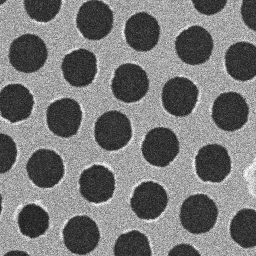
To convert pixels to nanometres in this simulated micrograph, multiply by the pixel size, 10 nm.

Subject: a regular array of holes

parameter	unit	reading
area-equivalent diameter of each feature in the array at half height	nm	387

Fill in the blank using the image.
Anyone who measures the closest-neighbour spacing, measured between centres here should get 516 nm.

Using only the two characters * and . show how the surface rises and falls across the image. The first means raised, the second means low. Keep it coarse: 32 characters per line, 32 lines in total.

***.....**...***********....**..
***....***....***********..***..
****..***.....**....**********..
**********....**....***..******.
***..*****...***....**....******
*.....**********....**.....**...
*.....***..***********.....*....
*.....**....***********...**....
**...***....***...**********....
********....**....***********...
*.*******..***.....**...********
....**********....**.....*******
....***..******..***.....**....*
....**....***********...***....*
....**....***...******.***.....*
******....**....***********....*
******....**....***...**********
..**********....**....**********
..***********..***....***...****
..**....**********....**.....***
..*.....***********..***.....***
.**.....**....***********....***
****....**....***********...****
*****.****....***...************
**********....**.....***..******
****************.....**....*****
***...***********...**.....***..
**....***...***********....**...
**....**....***********....**...
***..***.....**...***********...
********....**.....***********..
*..******..***.....**....*******